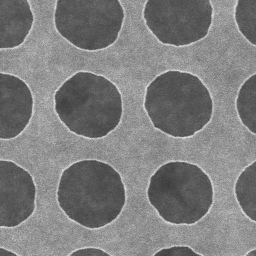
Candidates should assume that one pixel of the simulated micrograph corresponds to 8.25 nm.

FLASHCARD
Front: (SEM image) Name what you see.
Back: holes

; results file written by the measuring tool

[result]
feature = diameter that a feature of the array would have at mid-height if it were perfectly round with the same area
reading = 548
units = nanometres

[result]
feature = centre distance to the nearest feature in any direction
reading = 731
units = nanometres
